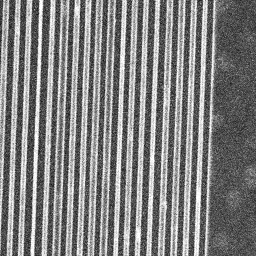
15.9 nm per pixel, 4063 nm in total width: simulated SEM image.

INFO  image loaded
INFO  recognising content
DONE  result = parallel lines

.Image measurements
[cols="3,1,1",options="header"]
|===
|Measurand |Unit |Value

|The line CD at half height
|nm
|73.4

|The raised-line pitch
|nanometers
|186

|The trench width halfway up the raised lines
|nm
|111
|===